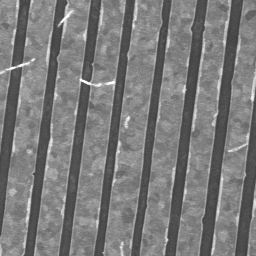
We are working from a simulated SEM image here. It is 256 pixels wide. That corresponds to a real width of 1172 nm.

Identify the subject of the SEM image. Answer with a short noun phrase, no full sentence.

parallel lines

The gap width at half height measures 51.7 nm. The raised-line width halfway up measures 0.111 micrometres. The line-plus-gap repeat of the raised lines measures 160 nm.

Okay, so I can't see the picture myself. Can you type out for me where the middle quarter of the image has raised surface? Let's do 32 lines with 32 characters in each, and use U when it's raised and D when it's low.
UUUUUDDUUUUUUDDDUUUUUUUDDUUUUUUD
UUUUUDDUUUUUUDDDUUUUUUUDDUUUUUUD
UUUUDDDUUUUUUDDDUUUUUUDDDUUUUUUD
UUUUDDDUUUUUUDDUUUUUUUDDDUUUUUUD
UUUUUDDUUUUUUDDUUUUUUUDDDUUUUUUD
UUUUDDUUUUUUUDDUUUUUUUDDUUUUUUDD
UUUUDDDUUUUUDDDUUUUUUUDDUUUUUUDD
UUUUDDDUUUUUDDDUUUUUUUDDUUUUUUDD
UUUUDDUUUUUUDDDUUUUUUDDDUUUUUUDD
UUUUDDUUUUUUDDDUUUUUUDDDUUUUUUDD
UUUDDDUUUUUUDDDUUUUUUDDDUUUUUUDD
UUUDDDUUUUUUDDUUUUUUUDDDUUUUUUDD
UUUDDDUUUUUUDDUUUUUUUDDDUUUUUUDD
UUUDDDUUUUUUDDUUUUUUUDDUUUUUUDDD
UUUDDDUUUUUDDDUUUUUUUDDUUUUUUDDD
UUUDDUUUUUUDDDUUUUUUUDDUUUUUUDDD
UUDDDUUUUUUDDDUUUUUUDDDUUUUUUDDD
UUDDDUUUUUUDDDUUUUUUDDDUUUUUUDDD
UUDDDUUUUUUDDDUUUUUUDDDUUUUUUDDD
UUDDDUUUUUUDDDUUUUUUDDDUUUUUUDDD
UUDDDUUUUUUDDDUUUUUUDDDUUUUUDDDU
UUDDDUUUUUUDDUUUUUUUDDUUUUUUDDDU
UUDDDUUUUUUDDUUUUUUUDDUUUUUUDDDU
UUDDDUUUUUDDDUUUUUUUDDUUUUUUDDDU
UDDDUUUUUUDDDUUUUUUUDDUUUUUUDDDU
UDDDUUUUUUDDDUUUUUUUDDUUUUUUDDDU
UDDDUUUUUUDDDUUUUUUDDDUUUUUUDDDU
UDDDUUUUUUDDDUUUUUUDDDUUUUUUDDDU
UDDDUUUUUUDDUUUUUUUDDUUUUUUDDDUU
UDDDUUUUUUDDUUUUUUUDDUUUUUUDDDUU
UDDDUUUUUDDDUUUUUUUDDUUUUUUDDDUU
UDDDUUUUUDDDUUUUUUUDDUUUUUUDDDUU